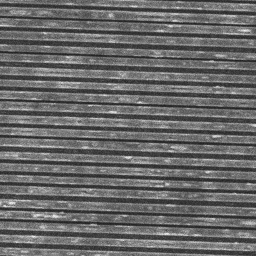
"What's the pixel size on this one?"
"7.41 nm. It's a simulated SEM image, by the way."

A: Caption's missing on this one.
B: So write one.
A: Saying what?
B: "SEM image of parallel lines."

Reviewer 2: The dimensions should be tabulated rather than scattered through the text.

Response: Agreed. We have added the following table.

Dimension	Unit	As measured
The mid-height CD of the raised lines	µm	0.0556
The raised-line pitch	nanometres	88.6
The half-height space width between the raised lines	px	4.63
